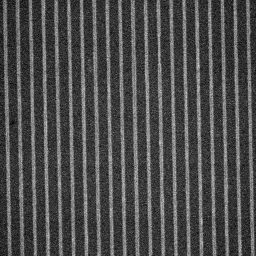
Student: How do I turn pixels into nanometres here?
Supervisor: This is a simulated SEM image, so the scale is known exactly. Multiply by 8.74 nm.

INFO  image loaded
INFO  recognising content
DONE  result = parallel lines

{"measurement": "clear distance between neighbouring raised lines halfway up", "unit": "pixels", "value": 10.2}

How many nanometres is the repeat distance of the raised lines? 112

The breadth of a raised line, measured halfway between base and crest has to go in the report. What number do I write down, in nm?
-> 20.7